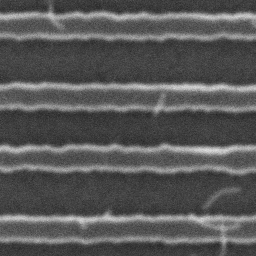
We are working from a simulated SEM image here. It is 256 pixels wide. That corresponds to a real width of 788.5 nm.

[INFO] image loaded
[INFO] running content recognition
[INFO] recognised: lines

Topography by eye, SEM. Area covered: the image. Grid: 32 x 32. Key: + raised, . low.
................................
................................
++++++++++++++++++++++++++++++++
++++++++++++++++++++++++++++++++
++++++++++++++++++++++++++++++++
................................
................................
................................
................................
................................
..+.............................
++++++++++++++++++++++++++++++++
++++++++++++++++++++++++++++++++
++.++.++++++++++++++++++++++++++
................................
................................
................................
................................
+..++++.++++++++++.+++++.....+++
++++++++++++++++++++++++++++++++
++++++++++++++++++++++++++++++++
.............................++.
................................
................................
................................
................................
................................
++++++++++++++++++++++++++++++++
++++++++++++++++++++++++++++++++
++++++++++++++++++++++++++++++++
................................
................................